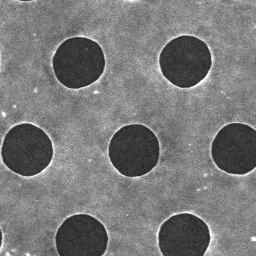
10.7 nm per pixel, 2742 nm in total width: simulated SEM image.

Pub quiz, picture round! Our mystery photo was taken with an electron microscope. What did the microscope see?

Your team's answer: holes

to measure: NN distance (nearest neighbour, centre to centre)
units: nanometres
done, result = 1100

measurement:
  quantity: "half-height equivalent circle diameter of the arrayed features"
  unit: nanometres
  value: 560